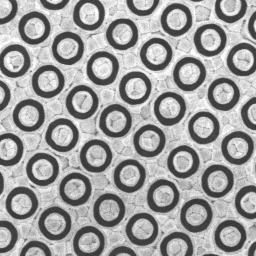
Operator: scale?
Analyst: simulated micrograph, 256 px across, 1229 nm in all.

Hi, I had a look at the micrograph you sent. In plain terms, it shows a regular array of ring-shaped grooves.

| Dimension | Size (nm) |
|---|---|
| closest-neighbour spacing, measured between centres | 185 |